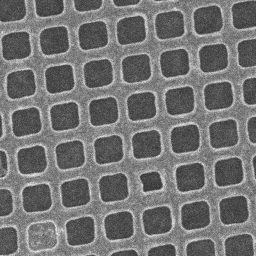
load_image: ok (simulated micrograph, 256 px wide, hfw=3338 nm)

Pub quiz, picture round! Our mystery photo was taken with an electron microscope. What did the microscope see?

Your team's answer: a regular array of holes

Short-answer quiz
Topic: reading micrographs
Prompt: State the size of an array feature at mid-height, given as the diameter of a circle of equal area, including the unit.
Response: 399 nanometres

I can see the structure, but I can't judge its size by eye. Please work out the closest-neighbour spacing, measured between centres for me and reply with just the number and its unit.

500 nanometers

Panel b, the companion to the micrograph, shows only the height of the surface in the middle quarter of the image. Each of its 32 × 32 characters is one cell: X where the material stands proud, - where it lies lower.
--XXX-------XX--------XX--------
--XXX-------XX--------XX-------X
--XXX-------XXX-------XXX------X
---XX-------XXX------XXXXXXXXXXX
---XX-------XXX----XXXXXXXXXXXXX
---XX------XXXXXXXXXXXXXXXXXXX-X
--XXXXXXXXXXXXXXXXXXXXXXXX------
XXXXXXXXXXXXXXXXX------XX-------
XXXXXXXXXX---XXX-------XX-------
X-XXXXX------XXX-------XX-------
----XX-------XXX-------XX-------
----XX--------XX-------XXX------
----XX--------XX-------XXX----XX
----XXX-------XX------XXXXXXXXXX
----XXX------XXXXXXXXXXXXXXXXXXX
----XXXX-XXXXXXXXXXXXXXXXXXXX---
-XXXXXXXXXXXXXXXXXXXX--XXXX-----
XXXXXXXXXXXXXXXXXX------XXX-----
XXXXXXXXX-----XXX-------XXX-----
-----XXX-------XX-------XXX-----
-----XX--------XX-------XXX-----
-----XXX-------XX-------XXX-----
-----XXX-------XX-------XXXX-XXX
-----XXX-------XXX---XXXXXXXXXXX
-----XXX------XXXXXXXXXXXXXXXXXX
-----XXXXXXXXXXXXXXXXXXXXXXXX---
-XXXXXXXXXXXXXXXXXXXXXXXXXXX----
XXXXXXXXXXXX---XXXX-----XXXX----
XXXX-XXXX-------XXX-----XXXX----
------XXX-------XXX-----XXXX----
------XXX-------XXXX-----XXX----
------XXX-------XXXX----XXXXX---